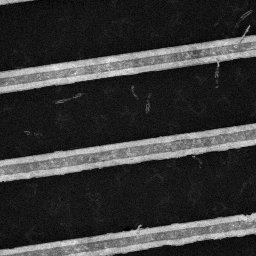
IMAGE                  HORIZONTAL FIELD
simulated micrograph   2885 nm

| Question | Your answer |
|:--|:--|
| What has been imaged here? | one or a few lines or trenches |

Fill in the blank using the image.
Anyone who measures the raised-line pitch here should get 989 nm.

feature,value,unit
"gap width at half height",825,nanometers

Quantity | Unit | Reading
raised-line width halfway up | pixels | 13.5